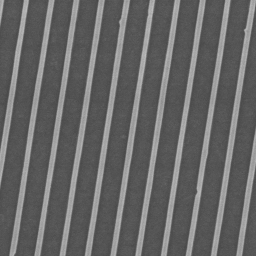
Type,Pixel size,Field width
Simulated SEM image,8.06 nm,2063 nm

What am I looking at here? parallel lines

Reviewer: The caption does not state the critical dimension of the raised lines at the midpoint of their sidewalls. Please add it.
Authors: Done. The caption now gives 37.8 nanometres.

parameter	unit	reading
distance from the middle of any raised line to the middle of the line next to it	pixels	24.9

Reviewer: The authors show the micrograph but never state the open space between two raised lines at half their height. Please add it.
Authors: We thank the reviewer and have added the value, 158 nm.